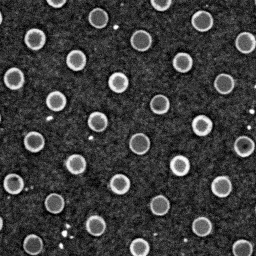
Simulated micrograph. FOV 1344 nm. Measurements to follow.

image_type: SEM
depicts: a regular array of raised bodies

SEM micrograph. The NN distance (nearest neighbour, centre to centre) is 0.238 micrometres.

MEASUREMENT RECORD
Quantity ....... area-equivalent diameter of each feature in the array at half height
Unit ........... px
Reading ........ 18.9